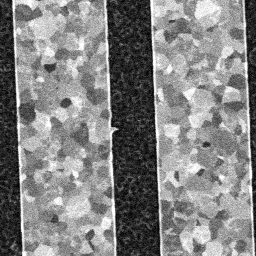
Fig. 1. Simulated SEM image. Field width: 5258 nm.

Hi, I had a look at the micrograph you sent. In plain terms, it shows one or a few lines or trenches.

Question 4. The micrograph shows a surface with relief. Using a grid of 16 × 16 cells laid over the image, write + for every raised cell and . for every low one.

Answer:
.++++++..++++++.
.++++++...+++++.
.++++++...+++++.
.++++++...+++++.
.++++++...+++++.
.++++++...+++++.
.++++++...+++++.
.++++++...++++++
.++++++...++++++
.++++++...++++++
.++++++...++++++
.++++++...++++++
.++++++...++++++
.++++++...++++++
.++++++...++++++
.++++++...++++++